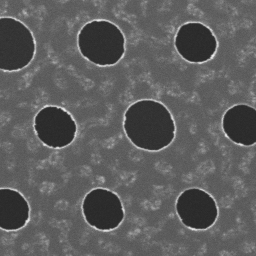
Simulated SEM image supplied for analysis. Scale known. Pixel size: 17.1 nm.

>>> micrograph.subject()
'holes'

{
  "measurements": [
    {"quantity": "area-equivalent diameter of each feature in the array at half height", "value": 0.695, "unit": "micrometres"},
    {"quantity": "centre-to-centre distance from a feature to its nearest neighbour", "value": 1610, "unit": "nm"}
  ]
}